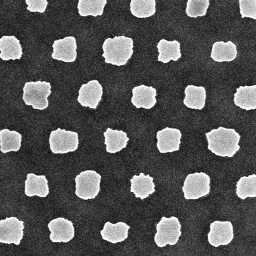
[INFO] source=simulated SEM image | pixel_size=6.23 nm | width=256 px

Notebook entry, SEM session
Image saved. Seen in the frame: a regular array of raised bodies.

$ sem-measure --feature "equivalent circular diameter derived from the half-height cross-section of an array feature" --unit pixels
25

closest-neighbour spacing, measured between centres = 51 pixels